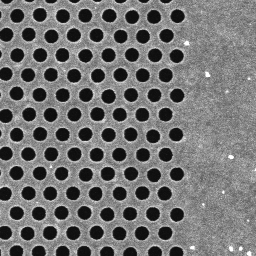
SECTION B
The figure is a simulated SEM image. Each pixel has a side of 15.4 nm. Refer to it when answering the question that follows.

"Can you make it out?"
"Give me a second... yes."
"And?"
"a regular array of holes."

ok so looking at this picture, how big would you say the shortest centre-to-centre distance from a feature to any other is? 0.34 um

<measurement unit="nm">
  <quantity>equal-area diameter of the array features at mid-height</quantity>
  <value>219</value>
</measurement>